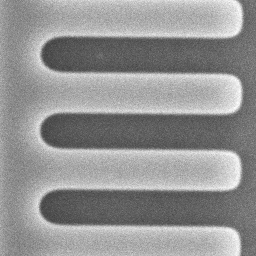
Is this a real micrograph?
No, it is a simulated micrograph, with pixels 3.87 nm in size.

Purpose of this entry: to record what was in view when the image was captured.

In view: groups of lines, slits or small figures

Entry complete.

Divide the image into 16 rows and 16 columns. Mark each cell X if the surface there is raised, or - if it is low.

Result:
XXXXXXXXXXXXXXX-
XXXXXXXXXXXXXXX-
XXX-------------
XXX-------------
XXXX------------
XXXXXXXXXXXXXXX-
XXXXXXXXXXXXXXX-
XXX-------------
XXX-------------
XXXXXXXXXXXXXX--
XXXXXXXXXXXXXXX-
XXXXXXXXXXXXXXX-
XXX-------------
XXX-------------
XXXXXXXXXXXXXXX-
XXXXXXXXXXXXXXX-